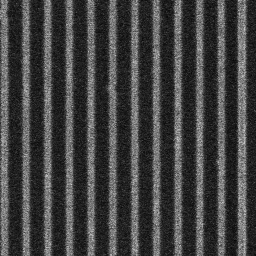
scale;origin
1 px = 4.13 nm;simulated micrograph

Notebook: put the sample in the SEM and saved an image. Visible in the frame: parallel lines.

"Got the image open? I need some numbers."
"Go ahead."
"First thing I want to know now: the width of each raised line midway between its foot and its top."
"8.62 px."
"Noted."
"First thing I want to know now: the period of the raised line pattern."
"0.0893 microns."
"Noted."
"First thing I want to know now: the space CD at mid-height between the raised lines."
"53.7 nanometers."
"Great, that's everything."